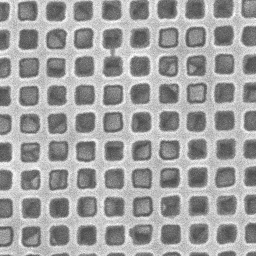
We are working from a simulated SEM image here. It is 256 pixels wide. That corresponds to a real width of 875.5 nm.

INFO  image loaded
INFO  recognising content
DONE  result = a regular array of holes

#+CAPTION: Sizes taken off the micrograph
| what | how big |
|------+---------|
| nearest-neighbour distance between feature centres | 94.2 nm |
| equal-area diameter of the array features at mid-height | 21.8 pixels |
